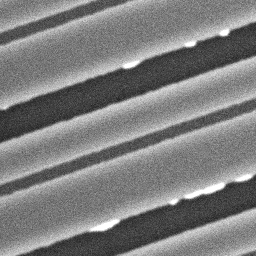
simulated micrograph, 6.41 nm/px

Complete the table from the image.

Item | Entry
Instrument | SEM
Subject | lines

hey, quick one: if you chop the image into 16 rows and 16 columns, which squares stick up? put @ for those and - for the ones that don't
@@@@@@@@@@@@@@@@
@@@@@@@@@@@@@@@-
@@@@@@@@@@@@@---
@@@@@@@@@@------
@@@@@@@------@@@
@@@@------@@@@@@
@------@@@@@@@@@
----@@@@@@@@@@@@
-@@@@@@@@@@@@@@@
@@@@@@@@@@@@@@@@
@@@@@@@@@@@@@@@@
@@@@@@@@@@@@@@--
@@@@@@@@@@@-----
@@@@@@@@-------@
@@@@@-------@@@@
@@-------@@@@@@@